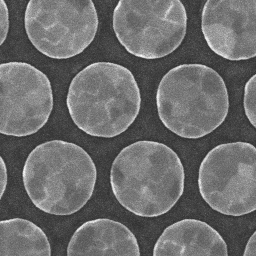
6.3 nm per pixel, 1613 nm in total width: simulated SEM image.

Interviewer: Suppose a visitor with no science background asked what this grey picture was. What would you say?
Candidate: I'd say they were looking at raised bodies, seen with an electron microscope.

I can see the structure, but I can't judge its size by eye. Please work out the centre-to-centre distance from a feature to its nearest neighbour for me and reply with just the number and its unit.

0.557 microns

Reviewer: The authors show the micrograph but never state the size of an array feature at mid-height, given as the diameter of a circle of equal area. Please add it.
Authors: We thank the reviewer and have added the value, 465 nm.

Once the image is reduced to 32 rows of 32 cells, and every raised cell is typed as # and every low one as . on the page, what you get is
#...########...########...######
#..#########..#########..#######
#..#########..#########..#######
#..#########..#########..#######
#..#########...########...######
....#######....#######....######
.....#####......#####......#####
................................
####.......#####......####......
######...########....######.....
######...########...########...#
######...########...########..##
#######.##########..########..##
######...########...########...#
######...########...########...#
#####....#######.....#######....
####.......####.......####......
................................
....######......#####......#####
....#######....#######....######
#..#########..#########..#######
#..#########..#########..#######
#..#########..#########..#######
#..#########..#########..#######
....#######....########..#######
....#######....#######....######
......###........####......####.
.##.........##.........##.......
#####.....######.....#####......
######...########...########...#
######...########..#########...#
######..#########..#########...#